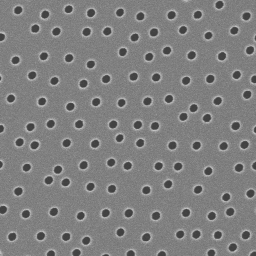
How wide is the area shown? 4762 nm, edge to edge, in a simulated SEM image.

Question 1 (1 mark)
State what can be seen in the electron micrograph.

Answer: a regular array of holes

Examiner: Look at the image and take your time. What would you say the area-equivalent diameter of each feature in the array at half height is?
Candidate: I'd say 154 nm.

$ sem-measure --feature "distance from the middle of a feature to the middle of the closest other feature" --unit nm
385